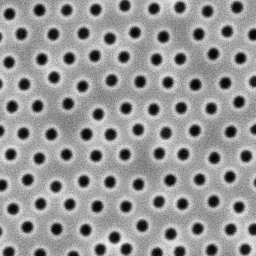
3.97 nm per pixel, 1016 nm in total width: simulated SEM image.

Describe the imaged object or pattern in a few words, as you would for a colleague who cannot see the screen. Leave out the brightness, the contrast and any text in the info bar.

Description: a regular array of holes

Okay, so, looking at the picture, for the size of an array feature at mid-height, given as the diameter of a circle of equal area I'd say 50.5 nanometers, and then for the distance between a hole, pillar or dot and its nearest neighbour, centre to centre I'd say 98.3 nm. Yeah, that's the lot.